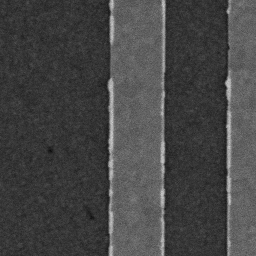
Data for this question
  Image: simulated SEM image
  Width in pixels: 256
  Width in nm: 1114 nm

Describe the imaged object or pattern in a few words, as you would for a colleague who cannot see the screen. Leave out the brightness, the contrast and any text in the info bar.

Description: one or a few lines or trenches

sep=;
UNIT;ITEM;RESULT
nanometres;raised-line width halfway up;237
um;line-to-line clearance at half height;0.275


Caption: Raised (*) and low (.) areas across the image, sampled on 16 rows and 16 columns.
.......***....**
.......***....**
.......***....**
.......***....**
.......***....**
.......***....**
.......***....**
.......***....**
.......***....**
.......***....**
.......***....**
.......***....**
.......***....**
.......***....**
.......***....**
.......***....**